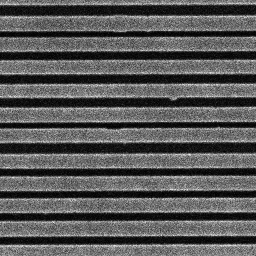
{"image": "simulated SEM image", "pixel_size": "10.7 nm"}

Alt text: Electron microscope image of parallel lines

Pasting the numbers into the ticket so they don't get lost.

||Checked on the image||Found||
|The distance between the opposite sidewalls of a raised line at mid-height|0.161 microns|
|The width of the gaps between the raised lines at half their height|80.5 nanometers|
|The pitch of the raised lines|0.244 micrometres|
